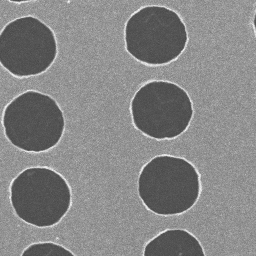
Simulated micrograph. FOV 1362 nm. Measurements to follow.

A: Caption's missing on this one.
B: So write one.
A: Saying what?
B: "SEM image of holes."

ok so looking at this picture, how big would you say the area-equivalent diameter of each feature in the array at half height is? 0.316 microns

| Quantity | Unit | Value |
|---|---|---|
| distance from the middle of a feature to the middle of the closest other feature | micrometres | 0.399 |